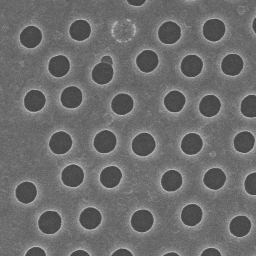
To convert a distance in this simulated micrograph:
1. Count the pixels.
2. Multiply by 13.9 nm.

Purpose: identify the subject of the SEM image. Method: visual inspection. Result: a regular array of holes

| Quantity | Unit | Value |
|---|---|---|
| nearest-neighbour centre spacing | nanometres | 530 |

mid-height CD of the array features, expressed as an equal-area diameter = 309 nm